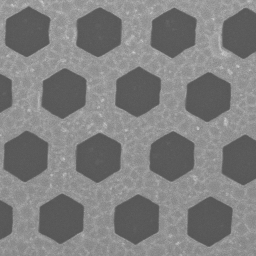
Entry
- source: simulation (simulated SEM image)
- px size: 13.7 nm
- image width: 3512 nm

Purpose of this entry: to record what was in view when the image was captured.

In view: a regular array of holes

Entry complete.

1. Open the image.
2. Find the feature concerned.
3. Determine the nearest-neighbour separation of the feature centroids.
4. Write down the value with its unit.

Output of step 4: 974 nm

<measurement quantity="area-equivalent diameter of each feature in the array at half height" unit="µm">0.64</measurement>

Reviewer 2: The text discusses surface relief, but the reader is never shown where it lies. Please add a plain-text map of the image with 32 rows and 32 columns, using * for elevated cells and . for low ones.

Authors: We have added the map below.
********************************
**...******...*******..*******..
*.....****.....****.....****....
*.....****.....****......***....
*.....****.....****......***....
*.....****.....****.....****....
**...******...******...******...
********************************
*****************.**************
.*****....*****.....*****..*****
.****......****.....****.....***
.****......****.....***......***
..***......***......***......***
.****.....*****....****......***
*******.****************...*****
********************************
***.*****************.**********
*....******...******....*****...
*.....****.....****.....****....
......***......****.....****....
......***......****.....****....
*....*****.....****.....****....
***.*******..********.*******...
********************************
*******.*********.**************
.*****....*****.....*****...****
..***......***......***......***
..***.....****......***......***
..***.....****......***......***
.*****...******....*****....****
*************************..*****
********************************